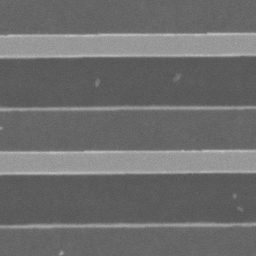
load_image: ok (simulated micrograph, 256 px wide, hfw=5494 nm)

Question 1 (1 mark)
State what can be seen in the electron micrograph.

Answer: lines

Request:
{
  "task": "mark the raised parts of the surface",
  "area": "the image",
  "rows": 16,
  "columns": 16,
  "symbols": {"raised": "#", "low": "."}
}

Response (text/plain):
################
################
################
########........
................
................
................
################
################
################
################
................
................
................
################
################